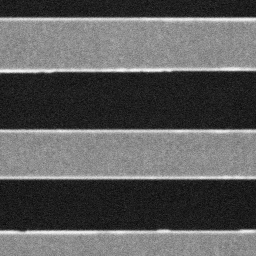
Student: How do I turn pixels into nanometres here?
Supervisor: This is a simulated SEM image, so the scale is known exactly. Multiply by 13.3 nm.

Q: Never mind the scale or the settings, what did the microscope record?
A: lines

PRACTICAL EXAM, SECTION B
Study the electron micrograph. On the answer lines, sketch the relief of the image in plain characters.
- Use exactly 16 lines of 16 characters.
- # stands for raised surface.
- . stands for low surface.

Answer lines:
................
################
################
################
................
................
................
................
################
################
################
................
................
................
################
################